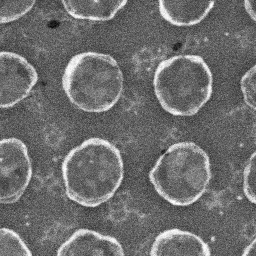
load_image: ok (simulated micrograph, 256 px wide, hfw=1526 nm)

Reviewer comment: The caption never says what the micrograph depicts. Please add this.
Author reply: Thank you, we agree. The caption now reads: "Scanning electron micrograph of raised bodies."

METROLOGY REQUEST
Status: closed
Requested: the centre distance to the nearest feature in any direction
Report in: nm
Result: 528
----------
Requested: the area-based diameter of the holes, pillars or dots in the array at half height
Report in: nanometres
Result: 349